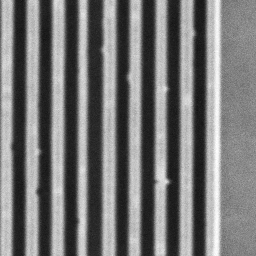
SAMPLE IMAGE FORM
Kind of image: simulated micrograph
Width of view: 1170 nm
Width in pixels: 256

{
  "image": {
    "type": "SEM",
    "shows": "parallel lines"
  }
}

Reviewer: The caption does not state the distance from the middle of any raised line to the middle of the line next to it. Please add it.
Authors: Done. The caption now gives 118 nm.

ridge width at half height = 51.5 nanometers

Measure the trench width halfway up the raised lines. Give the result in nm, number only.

67.5